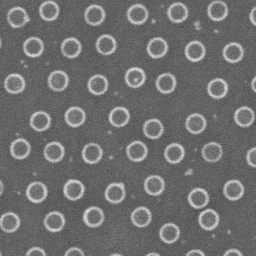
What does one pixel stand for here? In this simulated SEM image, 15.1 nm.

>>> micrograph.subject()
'a regular array of raised bodies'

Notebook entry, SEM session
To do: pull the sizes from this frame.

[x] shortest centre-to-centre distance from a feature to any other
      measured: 505 nanometres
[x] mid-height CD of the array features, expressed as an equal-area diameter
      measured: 0.285 microns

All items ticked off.